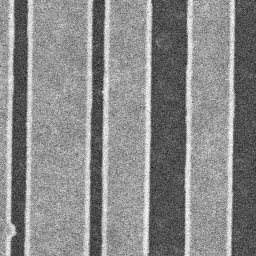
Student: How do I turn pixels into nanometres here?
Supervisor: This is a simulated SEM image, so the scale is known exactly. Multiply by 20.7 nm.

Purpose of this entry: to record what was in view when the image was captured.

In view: one or a few lines or trenches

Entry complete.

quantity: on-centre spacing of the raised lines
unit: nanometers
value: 1560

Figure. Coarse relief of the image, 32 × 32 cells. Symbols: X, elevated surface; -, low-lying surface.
X---XXXXXXX--XXXXXX-----XXXXX---
X---XXXXXXX--XXXXXX-----XXXXX---
X---XXXXXXX--XXXXXX-----XXXXX---
X---XXXXXXX--XXXXXX-----XXXXX---
X---XXXXXXX--XXXXXX-----XXXXX---
X---XXXXXXX--XXXXXX-----XXXXX---
X---XXXXXXX--XXXXXX-----XXXXX---
X---XXXXXXX--XXXXX------XXXXX---
X---XXXXXXX--XXXXX------XXXXX---
X---XXXXXXX--XXXXX------XXXXX---
X---XXXXXXX--XXXXX------XXXXX---
X---XXXXXXX--XXXXX------XXXXX---
X---XXXXXXX--XXXXX------XXXXX---
X---XXXXXXX--XXXXX------XXXXX---
X---XXXXXXX--XXXXX------XXXXX---
X---XXXXXXX--XXXXXX-----XXXXX---
X---XXXXXXX--XXXXX------XXXXX---
X---XXXXXXX--XXXXX------XXXXX---
X---XXXXXXX--XXXXX------XXXXX---
X---XXXXXXX--XXXXX------XXXXX---
X---XXXXXXX--XXXXX------XXXXX---
X---XXXXXXX--XXXXX------XXXXX---
X---XXXXXXX--XXXXX------XXXXX---
X---XXXXXXX--XXXXX-----XXXXXX---
X---XXXXXXX--XXXXX-----XXXXXX---
X---XXXXXXX--XXXXX-----XXXXXX---
X--XXXXXXXX--XXXXX-----XXXXXX---
X--XXXXXXXX--XXXXX------XXXXX---
XX-XXXXXXXX--XXXXX------XXXXX---
X--XXXXXXXX--XXXXX------XXXXX---
X--XXXXXXXX--XXXXX------XXXXX---
X--XXXXXXXX--XXXXX-----XXXXXX---